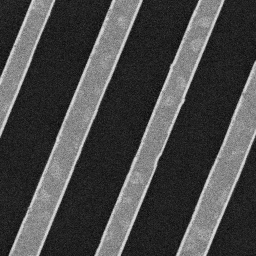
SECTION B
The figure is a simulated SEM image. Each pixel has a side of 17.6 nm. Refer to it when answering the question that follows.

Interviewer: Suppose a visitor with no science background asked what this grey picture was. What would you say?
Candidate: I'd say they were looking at one or a few lines or trenches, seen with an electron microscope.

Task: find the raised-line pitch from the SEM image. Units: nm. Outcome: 1370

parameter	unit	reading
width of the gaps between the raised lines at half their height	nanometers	968